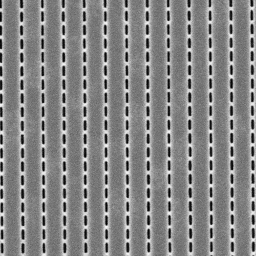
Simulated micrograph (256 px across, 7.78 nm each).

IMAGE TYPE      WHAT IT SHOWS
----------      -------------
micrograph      a regular array of holes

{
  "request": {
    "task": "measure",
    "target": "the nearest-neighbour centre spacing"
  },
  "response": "104 nm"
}